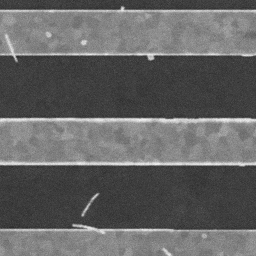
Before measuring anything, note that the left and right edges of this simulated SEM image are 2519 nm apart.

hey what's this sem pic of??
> lines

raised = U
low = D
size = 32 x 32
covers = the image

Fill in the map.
DDDDDDDDDDDDDDDDDDDDDDDDDDDDDDDD
UUUUUUUUUUUUUUUUUUUUUUUUUUUUUUUU
UUUUUUUUUUUUUUUUUUUUUUUUUUUUUUUU
UUUUUUUUUUUUUUUUUUUUUUUUUUUUUUUU
UUUUUUUUUUUUUUUUUUUUUUUUUUUUUUUU
UUUUUUUUUUUUUUUUUUUUUUUUUUUUUUUU
UUUUUUUUUUUUUUUUUUUUUUUUUUUUUUUU
DDDDDDDDDDDDDDDDDDDDDDDDDDDDDDDD
DDDDDDDDDDDDDDDDDDDDDDDDDDDDDDDD
DDDDDDDDDDDDDDDDDDDDDDDDDDDDDDDD
DDDDDDDDDDDDDDDDDDDDDDDDDDDDDDDD
DDDDDDDDDDDDDDDDDDDDDDDDDDDDDDDD
DDDDDDDDDDDDDDDDDDDDDDDDDDDDDDDD
DDDDDDDDDDDDDDDDDDDDDDDDDDDDDDDD
DDDDDDDDDDDDDDDDDDDDDDDDDDDDDDDD
UUUUUUUUUUUUUUUUUUUUUUUUUUUUUUUU
UUUUUUUUUUUUUUUUUUUUUUUUUUUUUUUU
UUUUUUUUUUUUUUUUUUUUUUUUUUUUUUUU
UUUUUUUUUUUUUUUUUUUUUUUUUUUUUUUU
UUUUUUUUUUUUUUUUUUUUUUUUUUUUUUUU
DDDDDDDDDDDDDDDDDUDDDDDDUDDDUUUU
DDDDDDDDDDDDDDDDDDDDDDDDDDDDDDDD
DDDDDDDDDDDDDDDDDDDDDDDDDDDDDDDD
DDDDDDDDDDDDDDDDDDDDDDDDDDDDDDDD
DDDDDDDDDDDDDDDDDDDDDDDDDDDDDDDD
DDDDDDDDDDDDDDDDDDDDDDDDDDDDDDDD
DDDDDDDDDDDDDDDDDDDDDDDDDDDDDDDD
DDDDDDDDDDDDDDDDDDDDDDDDDDDDDDDD
DDDDDDDDDDDUDDDDDDDDDDDDDDDDDDDD
UUUUUUUUUUUUUUUUUUUUUUUUUUUUUUUU
UUUUUUUUUUUUUUUUUUUUUUUUUUUUUUUU
UUUUUUUUUUUUUUUUUUUUUUUUUUUUUUUU